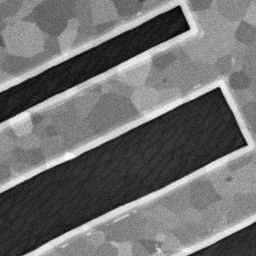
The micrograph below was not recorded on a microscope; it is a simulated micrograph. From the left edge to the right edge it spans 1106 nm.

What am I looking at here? one or a few lines or trenches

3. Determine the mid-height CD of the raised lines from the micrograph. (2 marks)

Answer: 255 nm